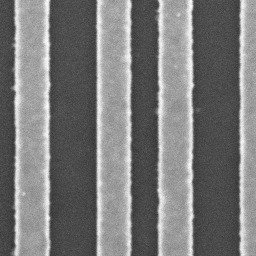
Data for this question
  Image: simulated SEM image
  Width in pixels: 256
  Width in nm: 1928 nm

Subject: lines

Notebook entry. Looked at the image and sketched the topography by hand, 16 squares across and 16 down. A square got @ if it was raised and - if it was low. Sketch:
-@@---@@--@@---@
-@@---@@--@@---@
-@@---@@--@@---@
-@@---@@--@@---@
-@@---@@--@@---@
-@@---@@--@@---@
-@@---@@--@@---@
-@@---@@--@@---@
-@@---@@--@@---@
-@@---@@--@@---@
-@@---@@--@@---@
-@@---@@--@@---@
-@@---@@--@@---@
-@@---@@--@@---@
-@@---@@--@@---@
-@@---@@--@@---@